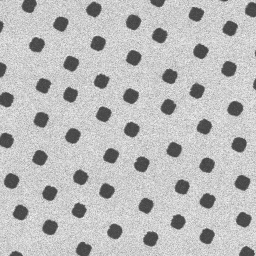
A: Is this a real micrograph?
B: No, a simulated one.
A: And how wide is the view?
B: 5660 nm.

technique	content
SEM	a regular array of holes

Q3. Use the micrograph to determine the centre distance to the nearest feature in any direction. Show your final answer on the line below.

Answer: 728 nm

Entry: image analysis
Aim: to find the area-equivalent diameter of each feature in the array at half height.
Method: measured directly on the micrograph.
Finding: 336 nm